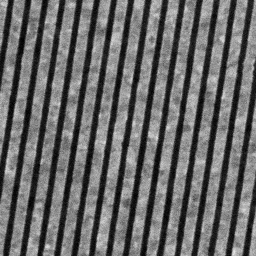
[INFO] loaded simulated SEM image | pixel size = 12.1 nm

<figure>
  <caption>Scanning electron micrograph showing parallel lines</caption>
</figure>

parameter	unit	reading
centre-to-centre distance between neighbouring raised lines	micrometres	0.204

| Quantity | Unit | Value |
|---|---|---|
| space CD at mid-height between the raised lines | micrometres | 0.0849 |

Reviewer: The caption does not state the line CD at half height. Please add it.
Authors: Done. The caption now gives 9.76 pixels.